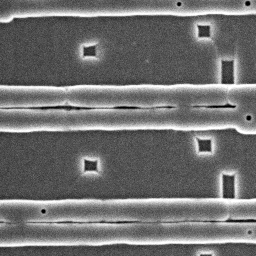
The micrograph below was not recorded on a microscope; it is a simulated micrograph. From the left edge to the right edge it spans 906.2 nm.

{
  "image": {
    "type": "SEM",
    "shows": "wiring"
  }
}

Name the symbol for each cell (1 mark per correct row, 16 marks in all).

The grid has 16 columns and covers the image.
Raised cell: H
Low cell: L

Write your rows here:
HHHHHHHHHHHHHHHH
LLLLLLLLLLLLLLLL
LLLLLLLLLLLLLLLL
LLLLLLLLLLLLLLLL
LLLLLLLLLLLLLLLL
HHHHHHHHHHHHHHHH
HHHHHHHHHHHHHHHH
HHHHHHHHHHHHHHHH
LLLLLLLLLLLLLLLL
LLLLLLLLLLLLLLLL
LLLLLLLLLLLLLLLL
LLLLLLLLLLLLLLLL
LLLLLLLLLHHHHHLH
HHHHHHHHHHHHHHHH
HHHHHHHHHHHHHHHH
LLLLLLLLLLLLLLLL